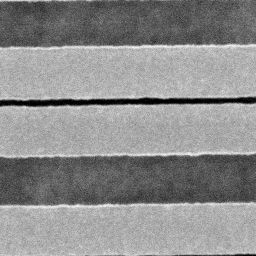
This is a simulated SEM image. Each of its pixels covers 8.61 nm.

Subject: lines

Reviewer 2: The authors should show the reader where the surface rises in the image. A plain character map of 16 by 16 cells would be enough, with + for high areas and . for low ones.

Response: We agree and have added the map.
................
................
................
++++++++++++++++
++++++++++++++++
++++++++++++++++
++++++++++++++++
++++++++++++++++
++++++++++++++++
++++++++++++++++
................
................
................
++++++++++++++++
++++++++++++++++
++++++++++++++++